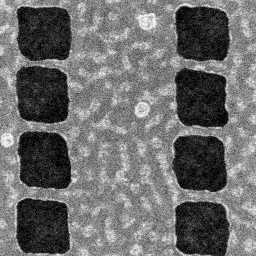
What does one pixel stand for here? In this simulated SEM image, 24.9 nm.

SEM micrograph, holes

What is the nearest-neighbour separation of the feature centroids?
1610 nanometres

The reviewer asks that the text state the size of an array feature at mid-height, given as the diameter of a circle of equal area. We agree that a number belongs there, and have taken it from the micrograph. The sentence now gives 1470 nanometers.